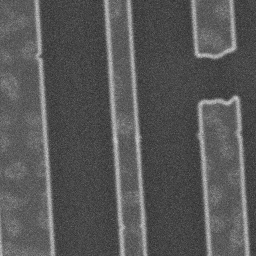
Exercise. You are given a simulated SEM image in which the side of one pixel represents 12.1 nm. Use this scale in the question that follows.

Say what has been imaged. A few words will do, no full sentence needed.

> one or a few lines or trenches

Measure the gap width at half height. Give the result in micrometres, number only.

0.839